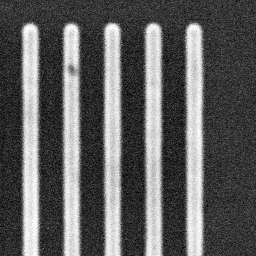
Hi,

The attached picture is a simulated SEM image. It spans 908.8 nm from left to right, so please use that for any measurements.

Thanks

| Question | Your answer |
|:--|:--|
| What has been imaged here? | groups of lines, slits or small figures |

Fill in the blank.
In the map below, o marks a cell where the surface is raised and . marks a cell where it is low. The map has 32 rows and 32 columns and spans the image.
................................
................................
................................
...o....oo...oo...oo....o.......
...oo...oo...oo...oo...oo.......
...oo...oo...oo...oo...oo.......
...oo...oo...oo...oo...oo.......
...oo...oo...oo...oo...oo.......
...oo...oo...oo...oo...oo.......
...oo...oo...oo...oo...oo.......
...oo...oo...oo...oo...oo.......
...oo...oo...oo...oo...oo.......
...oo...oo...oo...oo...oo.......
...oo...oo...oo...oo...oo.......
...oo...oo...oo...oo...oo.......
...oo...oo...oo...oo...oo.......
...oo...oo...oo...oo...oo.......
...oo...oo...oo...oo...oo.......
...oo...oo...oo...oo...oo.......
...oo...oo...oo...oo...oo.......
...oo...oo...oo...oo...oo.......
...oo...oo...oo...oo...oo.......
...oo...oo...oo...oo...oo.......
...oo...oo...oo...oo...oo.......
...oo...oo...oo...oo...oo.......
...oo...oo...oo...oo...oo.......
...oo...oo...oo...oo...oo.......
...oo...oo...oo...oo...oo.......
...oo...oo...oo...oo...oo.......
...oo...oo...oo...oo...oo.......
...oo...oo...oo...oo....o.......
...oo...oo...oo...oo....o.......